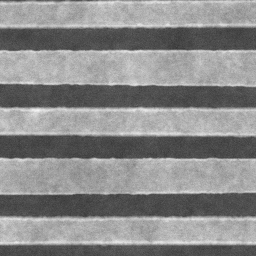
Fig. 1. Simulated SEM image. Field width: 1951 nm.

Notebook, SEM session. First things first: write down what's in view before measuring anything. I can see lines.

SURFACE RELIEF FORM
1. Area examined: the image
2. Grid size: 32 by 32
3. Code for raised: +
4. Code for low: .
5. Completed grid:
++++++++++++++++++++++++++++++++
++++++++++++++++++++++++++++++++
++++++++++++++++++++++++++++++++
................................
................................
................................
++++++++++++++++++++++++++++++++
++++++++++++++++++++++++++++++++
++++++++++++++++++++++++++++++++
++++++++++++++++++++++++++++++++
....++++++++++++++++++++++++++++
................................
................................
................................
++++++++++++++++++++++++++++++++
++++++++++++++++++++++++++++++++
++++++++++++++++++++++++++++++++
................................
................................
................................
++++++++++++++++++++++++++++++++
++++++++++++++++++++++++++++++++
++++++++++++++++++++++++++++++++
++++++++++++++++++++++++++++++++
................................
................................
................................
++++++++++++++++++++++++++++++++
++++++++++++++++++++++++++++++++
++++++++++++++++++++++++++++++++
............++....+............+
................................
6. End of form